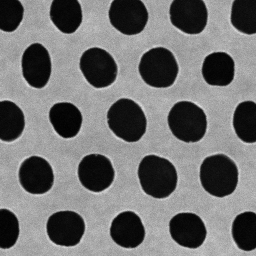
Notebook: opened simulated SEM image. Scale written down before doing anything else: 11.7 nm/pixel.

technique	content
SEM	a regular array of holes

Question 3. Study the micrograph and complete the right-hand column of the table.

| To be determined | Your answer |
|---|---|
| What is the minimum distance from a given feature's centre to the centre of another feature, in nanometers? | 705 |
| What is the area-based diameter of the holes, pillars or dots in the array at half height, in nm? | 440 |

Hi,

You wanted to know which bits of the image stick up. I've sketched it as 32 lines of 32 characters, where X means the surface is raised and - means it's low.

---XXX----XXXX----XXX-----XXX---
---XXX----XXXX----XXX-----XXX---
---XXX----XXXX----XXX-----XXX---
--XXXXX---XXXX----XXXX----XXX---
XXXXXXXXXXXXXXXXXXXXXXXXXXXXXXXX
XXXX-XXXXXXXXXXXXXXXXXXXXXXXXXXX
XXX---XXXXX--XXXXX---XXXXXX-XXXX
XXX---XXXX----XXXX----XXX----XXX
XXX---XXXX-----XX-----XXX----XXX
XXX---XXXXX----XXX----XXX----XXX
XXXX--XXXXX---XXXX----XXXX---XXX
XXXXXXXXXXXXXXXXXXXXXXXXXXXXXXXX
XXXXXXXXXXXXXXX-XXXXXXXXXXXXXXXX
--XXXX----XXXX----XXX----XXXXX--
---XXX----XXX-----XXX-----XXX---
---XXX----XXXX----XXX-----XXX---
---XXXX---XXXX----XXX-----XXX---
--XXXXXXXXXXXXX--XXXXXX--XXXXX--
XXXXXXXXXXXXXXXXXXXXXXXXXXXXXXXX
XXXX-XXXXXX--XXXXX--XXXXXX--XXXX
XXX---XXXX----XXX-----XXX----XXX
XX-----XXX----XXX-----XXX-----XX
XX-----XXX----XXX-----XXX-----XX
XXX---XXXXX--XXXXX----XXX----XXX
XXXXXXXXXXXXXXXXXXX--XXXXXX-XXXX
XXXXXXXXXXXXXXXXXXXXXXXXXXXXXXXX
-XXXXXX--XXXXXX--XXXXXX-XXXXXXXX
--XXXX----XXXX----XXX----XXXX---
--XXXX-----XXX----XXX-----XXX---
--XXXX----XXXX----XXX-----XXX---
--XXXXX---XXXXX---XXXX---XXXXX--
XXXXXXXXXXXXXXXXXXXXXXXXXXXXXXXX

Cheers